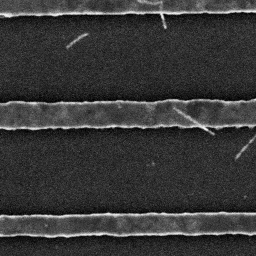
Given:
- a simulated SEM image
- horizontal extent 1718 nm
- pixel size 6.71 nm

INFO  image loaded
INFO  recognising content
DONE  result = lines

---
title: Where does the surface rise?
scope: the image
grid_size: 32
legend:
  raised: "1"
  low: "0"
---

11111111111111111111111111111111
11111111111111111111111111111000
00000000000000000000000000000000
00000000000000000000000000000000
00000000000000000000000000000000
00000000000000000000000000000000
00000000000000000000000000000000
00000000000000000000000000000000
00000000000000000000000000000000
00000000000000000000000000000000
00000000000000000000000000000000
00000000000000000000000000000000
00000000000000000000000000000000
11111111111111111111111111111111
11111111111111111111111111111111
11111111111111111111111111111111
00000000000000000000000000000000
00000000000000000000000000000000
00000000000000000000000000000000
00000000000000000000000000000000
00000000000000000000000000000000
00000000000000000000000000000000
00000000000000000000000000000000
00000000000000000000000000000000
00000000000000000000000000000000
00000000000000000000000000000000
00000000000000000000000000000000
11111111111111111111111111111111
11111111111111111111111111111111
00000110100000000000000000000000
00000000000000000000000000000000
00000000000000000000000000000000